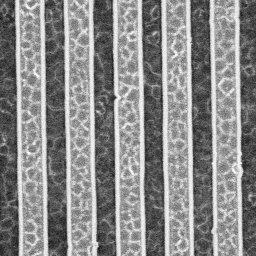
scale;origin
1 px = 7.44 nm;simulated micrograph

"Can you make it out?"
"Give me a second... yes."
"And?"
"parallel lines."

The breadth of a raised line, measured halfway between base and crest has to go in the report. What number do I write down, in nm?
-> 182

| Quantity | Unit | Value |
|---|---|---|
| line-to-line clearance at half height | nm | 182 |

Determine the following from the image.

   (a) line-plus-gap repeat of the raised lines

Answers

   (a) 362 nm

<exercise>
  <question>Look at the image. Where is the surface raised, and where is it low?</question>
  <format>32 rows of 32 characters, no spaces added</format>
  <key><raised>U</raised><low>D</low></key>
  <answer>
DDUUUDDDUUUDDDUUUDDDUUUDDDDUUUDD
DDUUUDDDUUUDDDUUUDDDUUUDDDDUUUDD
DDUUUDDDUUUDDDUUUDDDUUUDDDUUUUDD
DDUUUDDDUUUDDDDUUDDDDUUDDDDUUUDD
DDUUUDDDUUUDDDDUUDDDDUUUDDDUUUDD
DDUUUDDDUUUDDDDUUDDDDUUUDDDUUUDD
DDUUUDDDUUUDDDUUUDDDDUUDDDDUUUDD
DDUUUDDDUUUDDDUUUUDDDUUUDDDUUUDD
DDUUUDDDUUUDDDDUUUDDDUUUDDDUUUDD
DDUUUDDDUUUDDDDUUUDDDUUUDDDUUUDD
DDUUUDDDUUUDDDDUUUDDDUUUDDDUUUDD
DDDUUDDDUUUDDDDUUUDDDUUUDDDUUUDD
DDUUUDDDDUUDDDDUUUDDDUUUDDDUUUDD
DDUUUDDDUUUDDDDUUUDDDUUUDDDUUUDD
DDUUUDDDUUUDDDDUUUDDDUUUDDDUUUDD
DDUUUDDDUUUUDDDUUUDDDUUUDDDUUUDD
DDUUUDDDUUUUDDDUUUDDDUUUDDDUUUDD
DDUUUDDDDUUUDDDUUUDDDUUUDDDUUUDD
DDUUUDDDDUUUDDDUUUDDDUUUDDDUUUDD
DDDUUDDDDUUDDDDUUUDDDUUUDDDUUUDD
DDDUUDDDDUUDDDDUUUDDDUUUDDDUUUDD
DDDUUDDDDUUDDDDUUUDDDUUUDDDUUUDD
DDDUUDDDDUUUDDDUUUDDDUUUDDDUUUDD
DDDUUUDDDUUUDDDUUUDDDUUUDDDUUUDD
DDDUUUDDDUUUDDDUUUDDDUUUDDDUUUDD
DDDUUUDDDUUUDDDUUUDDDUUUDDDUUUDD
DDDUUUDDDUUUDDDUUUDDDUUUDDDUUUDD
DDDUUUDDDUUUDDDUUUDDDUUUDDDUUUDD
DDDUUUDDDUUUDDDUUUDDDUUUDDDUUUDD
DDDUUUDDDUUUDDDUUUDDDUUUDDDUUUDD
DDDUUUDDDUUUDDDUUUDDDUUUDDDUUUDD
DDDUUUDDDUUUDDDUUUDDDUUUDDDUUUDD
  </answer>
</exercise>